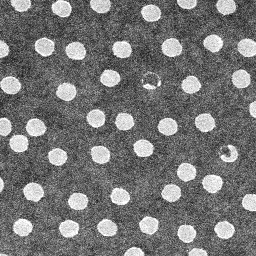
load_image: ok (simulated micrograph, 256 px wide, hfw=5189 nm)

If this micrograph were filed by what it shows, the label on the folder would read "a regular array of raised bodies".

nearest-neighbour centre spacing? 679 nanometres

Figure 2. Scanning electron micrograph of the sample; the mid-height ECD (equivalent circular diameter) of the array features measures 356 nanometres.